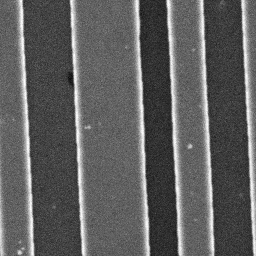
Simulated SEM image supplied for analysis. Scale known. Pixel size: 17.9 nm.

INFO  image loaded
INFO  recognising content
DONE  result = lines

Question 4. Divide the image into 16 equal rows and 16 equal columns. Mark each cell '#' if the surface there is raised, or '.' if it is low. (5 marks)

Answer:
#...#####..##..#
#...#####..##..#
#....####..##..#
##...####..##..#
##...####..##..#
##...####..##..#
##...####..##..#
##...####..##..#
##...####..##...
##...####..##...
##...####..##...
##...####..##...
##...####..##...
##...####..##...
##...####..##...
##...####..##...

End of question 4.